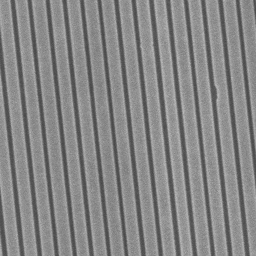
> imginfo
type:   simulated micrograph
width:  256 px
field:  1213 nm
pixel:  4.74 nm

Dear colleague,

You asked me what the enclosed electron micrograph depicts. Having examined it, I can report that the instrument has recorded parallel lines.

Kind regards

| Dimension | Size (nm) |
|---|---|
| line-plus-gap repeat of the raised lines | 81.6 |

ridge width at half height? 59.5 nanometres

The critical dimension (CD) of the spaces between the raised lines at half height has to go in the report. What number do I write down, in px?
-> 4.96